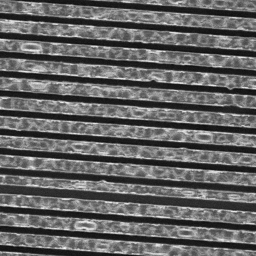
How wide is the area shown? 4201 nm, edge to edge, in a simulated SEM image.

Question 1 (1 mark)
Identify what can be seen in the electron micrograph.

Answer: parallel lines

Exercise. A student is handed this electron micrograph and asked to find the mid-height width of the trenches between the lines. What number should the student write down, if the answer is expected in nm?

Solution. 115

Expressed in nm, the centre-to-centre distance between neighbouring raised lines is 317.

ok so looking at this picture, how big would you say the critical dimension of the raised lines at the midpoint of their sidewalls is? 12.3 pixels